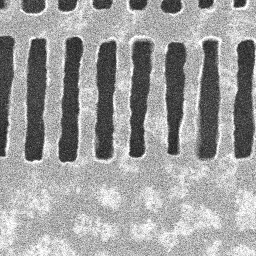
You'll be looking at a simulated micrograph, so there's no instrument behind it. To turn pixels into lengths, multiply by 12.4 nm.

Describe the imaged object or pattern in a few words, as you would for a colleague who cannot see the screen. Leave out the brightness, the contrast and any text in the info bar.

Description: holes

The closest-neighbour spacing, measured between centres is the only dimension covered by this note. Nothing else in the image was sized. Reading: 432 nanometres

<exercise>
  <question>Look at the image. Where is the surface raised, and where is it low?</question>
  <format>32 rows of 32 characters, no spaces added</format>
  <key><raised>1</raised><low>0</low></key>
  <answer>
01000010001100110011000110011001
11100111111111111111101111111111
11111111111111111111111111111111
11111111111111111111111111111111
11111111111111111111111111111111
00110011001110011001100110011100
00110011001100010001100110011100
00100011001100010001100110011100
00100011001100011001100110011100
00100011001100010001100110011100
00100011001100110001100110011100
01100011001100110001100110001100
01100011001100110011100110001000
01100011001100110011100110011000
01100111001100110011100110011000
01100011001100110011101110011000
01100011001100110011101110011000
01100010001100110011101110011000
01100110001100110011101100011000
11100110001100110011111110011001
11111111111111111111111111111111
11111111111111111111111111111111
11111111111111111111111111111111
11111111111111111111111111111111
11111111111111111111111111111111
11111111111111111111111111111111
11111111111111111111111111111111
11111111111111111111111111111111
11111111111111111111111111111111
11111111111111111111111111111111
11111111111111111111111111111111
11111111111111111111111111111111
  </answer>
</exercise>